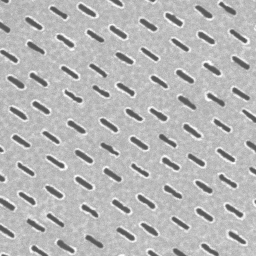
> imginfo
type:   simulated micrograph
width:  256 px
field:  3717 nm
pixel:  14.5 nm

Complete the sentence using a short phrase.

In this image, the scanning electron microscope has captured a regular array of holes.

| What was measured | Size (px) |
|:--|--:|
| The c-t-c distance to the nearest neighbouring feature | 25.7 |